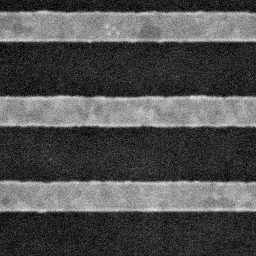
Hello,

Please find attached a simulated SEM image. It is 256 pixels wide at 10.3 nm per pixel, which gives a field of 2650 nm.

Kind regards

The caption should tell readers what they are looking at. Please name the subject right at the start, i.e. lines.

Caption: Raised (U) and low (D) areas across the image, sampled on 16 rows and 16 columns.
DDDDDDDDDDDDDDDD
UUUUUUUUUUUUUUUU
UUUUUUUUUUUUUUUU
DDDDDDDDDDDDDDDD
DDDDDDDDDDDDDDDD
DDDDDDDDDDDDDDDD
UUUUUUUUUUUUUUUU
UUUUUUUUUUUUUUUU
DDDDDDDDDDDDDDDD
DDDDDDDDDDDDDDDD
DDDDDDDDDDDDDDDD
UUUUUUUUUUUUUUUU
UUUUUUUUUUUUUUUU
DDDDDDDDDDDDDDDD
DDDDDDDDDDDDDDDD
DDDDDDDDDDDDDDDD